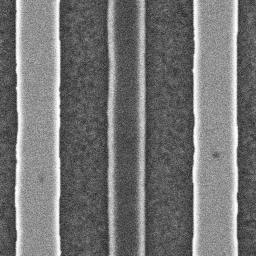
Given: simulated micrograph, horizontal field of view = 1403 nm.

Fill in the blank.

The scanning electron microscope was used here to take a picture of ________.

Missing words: lines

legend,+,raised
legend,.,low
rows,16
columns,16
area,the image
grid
.+++...++...+++.
.+++...++...+++.
.+++...++...+++.
.+++...++...+++.
.+++...++...+++.
.+++...++...+++.
.+++...++...+++.
.+++...++...+++.
.+++...++...+++.
.+++...++...+++.
.+++...++...+++.
.+++...++...+++.
.+++...++...+++.
.+++...++...+++.
.+++...++...+++.
.+++...++...+++.